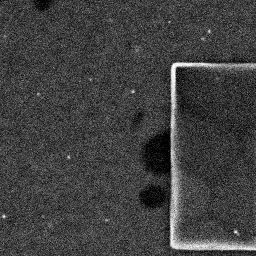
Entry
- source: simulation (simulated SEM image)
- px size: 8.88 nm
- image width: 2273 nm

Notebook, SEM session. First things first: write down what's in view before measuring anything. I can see wiring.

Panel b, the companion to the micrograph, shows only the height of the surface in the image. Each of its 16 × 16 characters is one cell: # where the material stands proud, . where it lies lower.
................
................
................
................
............####
............####
............####
...........#####
...........#####
...........#####
...........#####
...........#####
...........#####
...........#####
...........#####
...........#####